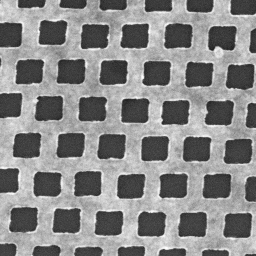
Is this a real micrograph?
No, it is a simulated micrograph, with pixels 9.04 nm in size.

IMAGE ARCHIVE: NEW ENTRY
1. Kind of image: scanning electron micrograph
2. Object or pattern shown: a regular array of holes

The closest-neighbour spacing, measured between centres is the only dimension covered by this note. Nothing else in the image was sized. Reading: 376 nanometers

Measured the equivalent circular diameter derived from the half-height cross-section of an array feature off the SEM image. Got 269 nanometres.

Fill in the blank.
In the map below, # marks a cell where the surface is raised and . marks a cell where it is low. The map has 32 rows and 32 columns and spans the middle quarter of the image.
.....####.......####.......###..
.....####.......####.......###..
.....####.......####.......###..
.....####.......###........###..
.....####.......###........###..
#####################.....####..
################################
################################
####.......#####....############
####.......###.......####......#
####.......###........##........
###........###.......###........
###........###.......###........
###........###.......###.......#
#####...######.......###.......#
################################
################################
.....####......#################
.....####.......####......####..
.....####.......###........###..
.....###........###........###..
.....###........###.......####..
.....###.......####.......####..
..#.#####......####.......####..
#####################..#######..
################################
################################
###.......####......####.......#
##........###........###.......#
##........###........###.......#
##.......####.......####.......#
##.......####.......####.......#